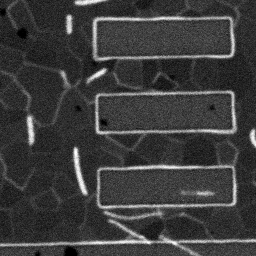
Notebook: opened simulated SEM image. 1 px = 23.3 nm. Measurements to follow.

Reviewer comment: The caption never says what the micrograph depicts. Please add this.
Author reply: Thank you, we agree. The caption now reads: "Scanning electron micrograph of groups of lines, slits or small figures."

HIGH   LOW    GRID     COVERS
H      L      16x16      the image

HHHHHHHHHHHHHHHH
HHHHHHLLLLLLLLHH
HHHHHHLLLLLLLLLH
HHHHHHLLLLLLLLHH
HHHHHHHHHHHHHHHH
HHHHHHHHHHHHHHHH
HHHHHHLLLLLLLLLH
HHHHHHLLLLLLLLLH
HHHHHHHHHHHHHHHH
HHHHHHHHHHHHHHHH
HHHHHHHHLLLLLLHH
HHHHHHLLLLLLLLLH
HHHHHHLLLLLLLLLH
HHHHHHHHHHHHHHHH
HHHHHHHHHHHHHHHH
LLLLLLLLLLLLLLLL